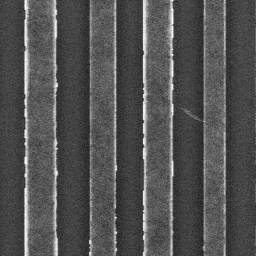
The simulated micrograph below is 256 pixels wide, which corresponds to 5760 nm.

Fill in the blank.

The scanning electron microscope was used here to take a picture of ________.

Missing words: lines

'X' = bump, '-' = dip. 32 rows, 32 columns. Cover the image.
---XXXX----XXX----XXX-----XX----
---XXXX----XXX----XXX-----XX----
---XXXX----XXX----XXX-----XX----
---XXXX----XXX----XXX-----XX----
---XXXX----XXX----XXX-----XX----
---XXXX----XXX----XXX-----XX----
---XXXX----XXX----XXX-----XX----
---XXXX----XXX----XXX-----XX----
---XXXX----XXX----XXX-----XX----
---XXXX----XXX----XXX-----XX----
---XXXX----XXX----XXX-----XX----
---XXXX----XXX----XXX-----XX----
---XXXX----XXX----XXX-----XX----
---XXXX----XXX----XXX-----XX----
---XXXX----XXX----XXX-----XX----
---XXXX----XXX----XXX-----XX----
---XXXX----XXX----XXX-----XX----
---XXXX----XXX----XXX-----XX----
---XXXX----XXX----XXX-----XX----
---XXXX----XXX----XXX-----XX----
---XXXX----XXX----XXX-----XX----
---XXXX----XXX----XXX-----XX----
---XXXX----XXX----XXX-----XX----
---XXXX----XXX----XXX-----XX----
---XXXX----XXX----XXX-----XX----
---XXXX----XXX----XXX-----XX----
---XXXX----XXX----XXX-----XX----
---XXXX----XXX----XXX-----XX----
---XXXX----XXX----XXX-----XX----
---XXXX----XXX----XXX-----XX----
---XXXX----XXX----XXX----XXX----
---XXXX----XXX----XXX----XXX----